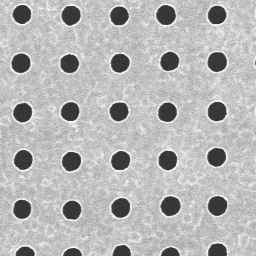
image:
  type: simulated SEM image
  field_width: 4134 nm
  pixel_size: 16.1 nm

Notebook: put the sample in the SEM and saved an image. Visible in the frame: a regular array of holes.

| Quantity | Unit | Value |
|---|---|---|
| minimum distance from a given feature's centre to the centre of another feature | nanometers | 758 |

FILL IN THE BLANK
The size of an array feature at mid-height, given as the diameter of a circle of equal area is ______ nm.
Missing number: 315